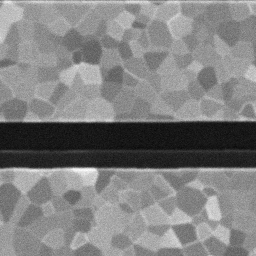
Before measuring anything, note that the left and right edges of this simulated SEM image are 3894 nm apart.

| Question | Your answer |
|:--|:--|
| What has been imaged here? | lines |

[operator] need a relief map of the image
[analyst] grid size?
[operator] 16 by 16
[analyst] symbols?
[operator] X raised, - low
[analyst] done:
XXXXXXXXXXXXXXXX
XXXXXXXXXXXXXXXX
XXXXXXXXXXXXXXXX
XXXXXXXXXXXXXXXX
XXXXXXXXXXXXXXXX
XXXXXXXXXXXXXXXX
XXXXXXXXXXXXXXXX
XXXXXXXXXXXXXXXX
----------------
----------------
----------------
XXXXXXXXXXXXXXXX
XXXXXXXXXXXXXXXX
XXXXXXXXXXXXXXXX
XXXXXXXXXXXXXXXX
XXXXXXXXXXXXXXXX